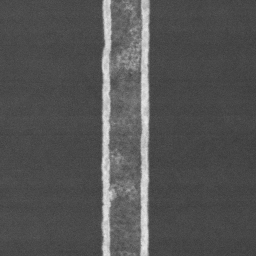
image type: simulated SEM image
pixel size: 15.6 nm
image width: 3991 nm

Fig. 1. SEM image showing one or a few lines or trenches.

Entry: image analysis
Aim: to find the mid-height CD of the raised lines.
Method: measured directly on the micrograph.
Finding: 606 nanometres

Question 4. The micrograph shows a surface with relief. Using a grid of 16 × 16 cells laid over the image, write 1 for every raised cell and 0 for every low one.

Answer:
0000000110000000
0000000110000000
0000000110000000
0000000110000000
0000000110000000
0000000110000000
0000000110000000
0000000110000000
0000000110000000
0000000110000000
0000000110000000
0000000110000000
0000000110000000
0000000110000000
0000000110000000
0000000110000000